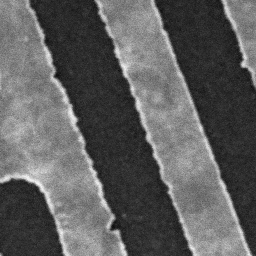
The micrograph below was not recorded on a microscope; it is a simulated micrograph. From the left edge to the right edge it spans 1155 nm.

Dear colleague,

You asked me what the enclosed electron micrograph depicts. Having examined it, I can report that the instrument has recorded one or a few lines or trenches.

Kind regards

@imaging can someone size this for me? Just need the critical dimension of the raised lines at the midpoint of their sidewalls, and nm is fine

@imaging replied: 236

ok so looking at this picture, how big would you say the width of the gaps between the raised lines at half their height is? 292 nm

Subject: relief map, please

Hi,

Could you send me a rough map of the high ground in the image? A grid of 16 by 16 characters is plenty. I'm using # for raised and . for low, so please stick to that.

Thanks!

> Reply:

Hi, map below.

##....####....##
##.....###.....#
###....###.....#
###....####....#
###.....###.....
####....####....
####.....###....
#####....###....
#####....####...
#####.....###...
######....####..
..####....####..
...###.....###..
...####....####.
....###.....###.
....####....###.